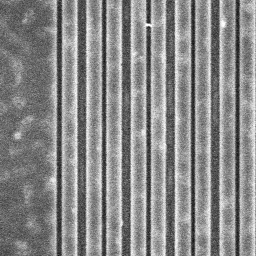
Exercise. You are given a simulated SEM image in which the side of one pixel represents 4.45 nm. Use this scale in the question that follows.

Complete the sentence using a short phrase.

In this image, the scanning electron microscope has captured parallel lines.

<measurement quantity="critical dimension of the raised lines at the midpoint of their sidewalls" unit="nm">67.9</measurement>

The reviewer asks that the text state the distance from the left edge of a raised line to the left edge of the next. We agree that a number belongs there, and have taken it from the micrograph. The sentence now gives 99.1 nanometers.